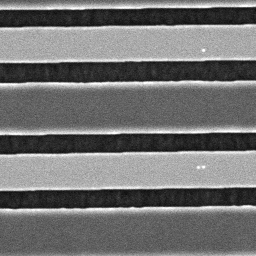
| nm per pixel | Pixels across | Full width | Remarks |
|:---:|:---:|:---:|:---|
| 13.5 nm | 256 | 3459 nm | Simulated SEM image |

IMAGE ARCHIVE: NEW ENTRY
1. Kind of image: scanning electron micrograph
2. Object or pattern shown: lines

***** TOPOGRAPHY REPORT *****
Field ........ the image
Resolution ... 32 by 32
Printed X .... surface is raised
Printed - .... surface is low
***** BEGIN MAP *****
XXXXXXXXXXXXXXXXXXXXXXXXXXXXXXXX
--------------------------------
--------------------------------
-----XX---XXXXXXXXXXXXXXXXXXXXXX
XXXXXXXXXXXXXXXXXXXXXXXXXXXXXXXX
XXXXXXXXXXXXXXXXXXXXXXXXXXXXXXXX
XXXXXXXXXXXXXXXXXXXXXXXXXXXXXXXX
XXXXXXXXXXXXXXXXXXXXXX-X--------
--------------------------------
--------------------------------
XXXXXXXXXXXXXXXXXXXXXXXXXXXXXXXX
XXXXXXXXXXXXXXXXXXXXXXXXXXXXXXXX
XXXXXXXXXXXXXXXXXXXXXXXXXXXXXXXX
XXXXXXXXXXXXXXXXXXXXXXXXXXXXXXXX
XXXXXXXXXXXXXXXXXXXXXXXXXXXXXXXX
XXXXXXXXXXXXXXXXXXXXXXXXXXXXXXXX
XXXXXXXXXXXXXXXXXXXXXXXXXX------
--------------------------------
--------------------------------
XXXXXXXXXXXXXXXXXXXXXXXXXXXXXXXX
XXXXXXXXXXXXXXXXXXXXXXXXXXXXXXXX
XXXXXXXXXXXXXXXXXXXXXXXXXXXXXXXX
XXXXXXXXXXXXXXXXXXXXXXXXXXXXXXXX
XXXXXXXXXXXXXXXXX---------------
--------------------------------
--------------------------------
XXXXXXXXXXXXXXXXXXXXXXXXXXXXXXXX
XXXXXXXXXXXXXXXXXXXXXXXXXXXXXXXX
XXXXXXXXXXXXXXXXXXXXXXXXXXXXXXXX
XXXXXXXXXXXXXXXXXXXXXXXXXXXXXXXX
XXXXXXXXXXXXXXXXXXXXXXXXXXXXXXXX
XXXXXXXXXXXXXXXXXXXXXXXXXXXXXXXX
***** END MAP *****